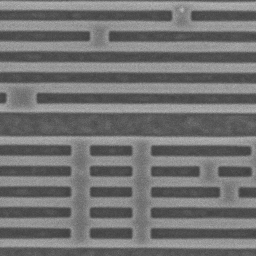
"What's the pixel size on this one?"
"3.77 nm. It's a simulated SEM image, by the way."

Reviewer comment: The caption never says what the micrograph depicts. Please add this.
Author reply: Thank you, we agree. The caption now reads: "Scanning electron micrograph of groups of lines, slits or small figures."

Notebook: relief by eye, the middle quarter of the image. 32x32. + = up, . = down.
++++++++++++++++++++++++++++++++
++++++++++++++++++++++++++++++++
................................
................................
................................
++++++++++++++++++++++++++++++++
++++++++++++++++++++++++++++++++
................................
................................
................................
++++++++++++++++++++++++++++++++
++++++++++++++++++++++++++++++++
................................
................................
................................
................................
................................
................................
++++++++++++++++++++++++++++++++
++++++++++++++++++++++++++++++++
..+++++..........+++++..........
..++++...........+++++..........
..+++++..........+++++..........
++++++++++++++++++++++++++++++++
++++++++++++++++++++++++++++++++
.++++++.........+++++++.+++++...
..++++...........+++++..........
..++++...........+++++..........
++++++++++++++++++++++++++++++++
++++++++++++++++++++++++++++++++
++++++++++++++++++++++++++++++++
..++++...........+++++..........